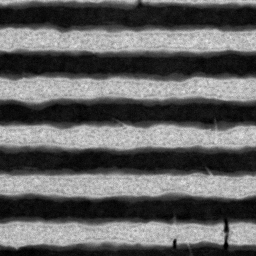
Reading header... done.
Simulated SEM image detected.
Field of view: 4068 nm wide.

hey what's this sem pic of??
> parallel lines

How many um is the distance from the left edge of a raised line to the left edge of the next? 0.766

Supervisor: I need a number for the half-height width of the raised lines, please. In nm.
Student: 373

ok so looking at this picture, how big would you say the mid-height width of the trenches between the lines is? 401 nm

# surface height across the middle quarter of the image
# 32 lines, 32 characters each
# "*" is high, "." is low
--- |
................................
................................
................................
*..****....*******.............*
********************************
********************************
********************************
********************************
********************************
................................
................................
................................
................................
................................
................................
..****************...**********.
********************************
********************************
********************************
********************************
********************************
.*...........*****..............
................................
................................
................................
................................
................................
*...*************........**.....
********************************
********************************
********************************
********************************